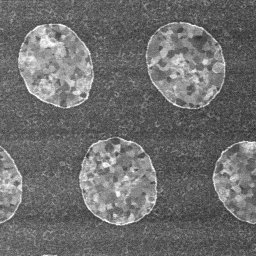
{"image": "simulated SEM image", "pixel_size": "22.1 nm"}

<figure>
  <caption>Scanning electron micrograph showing raised bodies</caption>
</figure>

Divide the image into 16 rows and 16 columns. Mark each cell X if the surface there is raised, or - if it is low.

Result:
----------------
-----------X----
--XXX----XXXX---
-XXXXX---XXXXX--
-XXXXX---XXXXX--
--XXXX----XXXX--
---XX------XX---
----------------
----------------
-----XXXX-----XX
X----XXXXX---XXX
X----XXXXX---XXX
X----XXXXX----XX
X-----XXX------X
----------------
----------------